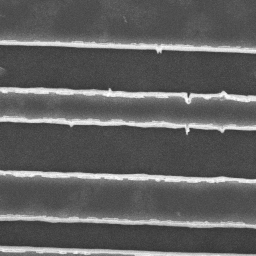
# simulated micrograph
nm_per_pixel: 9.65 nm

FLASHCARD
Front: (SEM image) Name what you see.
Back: one or a few lines or trenches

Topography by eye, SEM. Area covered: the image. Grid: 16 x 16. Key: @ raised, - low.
@@@@@@@@@@@@@@@@
@@@@@@@@@@@@@@@@
@@@@@@@@@@@@@@@@
----------------
----------------
----------------
@@@@@@@@@@@@@@@@
@@@@@@@@@@@@@@@@
----------------
----------------
----------------
@@@@@@@@@@@@@@@@
@@@@@@@@@@@@@@@@
@@@@@@@@@@@@@@@@
----------------
----------------